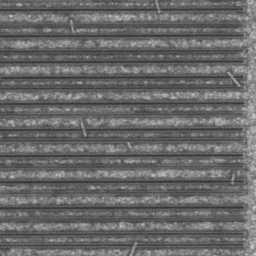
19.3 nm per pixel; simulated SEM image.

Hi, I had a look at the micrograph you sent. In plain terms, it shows parallel lines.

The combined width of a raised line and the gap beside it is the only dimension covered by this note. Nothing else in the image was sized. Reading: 0.252 µm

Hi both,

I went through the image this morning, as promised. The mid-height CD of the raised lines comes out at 74.7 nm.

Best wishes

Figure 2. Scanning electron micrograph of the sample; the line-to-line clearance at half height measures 150 nanometres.